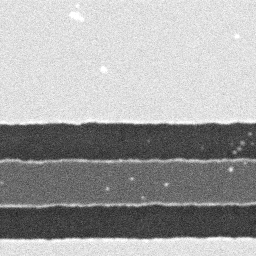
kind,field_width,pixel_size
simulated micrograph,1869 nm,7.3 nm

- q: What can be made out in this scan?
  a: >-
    lines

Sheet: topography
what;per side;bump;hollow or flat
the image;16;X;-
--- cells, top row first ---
XXXXXXXXXXXXXXXX
XXXXXXXXXXXXXXXX
XXXXXXXXXXXXXXXX
XXXXXXXXXXXXXXXX
XXXXXXXXXXXXXXXX
XXXXXXXXXXXXXXXX
XXXXXXXXXXXXXXXX
XXXXXXXXXXXXXXXX
----------------
----------------
XXXXXXXXXXXXXXXX
XXXXXXXXXXXXXXXX
XXXXXXXXXXXXXXXX
----------------
----------------
XXXXXXXXXXXXXXXX